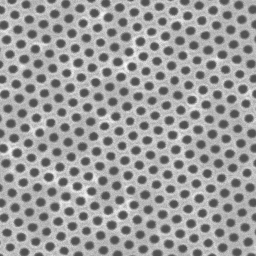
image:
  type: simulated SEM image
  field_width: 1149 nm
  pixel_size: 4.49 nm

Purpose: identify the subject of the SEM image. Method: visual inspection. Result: a regular array of holes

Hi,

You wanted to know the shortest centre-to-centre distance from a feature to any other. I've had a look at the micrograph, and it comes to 66.4 nm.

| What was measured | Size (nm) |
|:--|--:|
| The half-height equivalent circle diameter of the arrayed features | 41.5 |